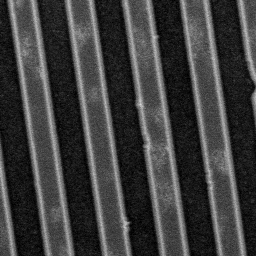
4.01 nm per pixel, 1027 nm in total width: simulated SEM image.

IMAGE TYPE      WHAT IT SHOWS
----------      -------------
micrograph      parallel lines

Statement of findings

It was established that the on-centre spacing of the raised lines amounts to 0.228 microns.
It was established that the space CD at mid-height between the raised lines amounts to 127 nanometres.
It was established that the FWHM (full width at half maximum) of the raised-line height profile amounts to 0.1 um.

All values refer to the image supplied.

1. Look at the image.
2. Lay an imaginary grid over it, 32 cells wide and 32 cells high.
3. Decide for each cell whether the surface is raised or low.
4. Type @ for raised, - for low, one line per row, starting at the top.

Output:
-@@@----@@@@----@@@----@@@----@@
-@@@@----@@@----@@@----@@@----@@
--@@@----@@@----@@@----@@@----@@
--@@@----@@@----@@@----@@@----@@
--@@@----@@@----@@@----@@@@----@
--@@@----@@@----@@@@---@@@@----@
--@@@----@@@----@@@@----@@@----@
--@@@----@@@@----@@@----@@@----@
--@@@@----@@@----@@@----@@@----@
---@@@----@@@----@@@----@@@-----
---@@@----@@@----@@@----@@@-----
---@@@----@@@----@@@----@@@@----
---@@@----@@@----@@@@---@@@@----
---@@@----@@@----@@@@----@@@----
---@@@----@@@@----@@@----@@@----
---@@@@----@@@----@@@----@@@----
----@@@----@@@----@@@----@@@----
----@@@----@@@----@@@----@@@----
----@@@----@@@----@@@----@@@@---
----@@@----@@@----@@@@---@@@@---
----@@@----@@@----@@@@----@@@---
----@@@----@@@@----@@@----@@@---
----@@@@----@@@----@@@----@@@---
@----@@@----@@@----@@@----@@@---
@----@@@----@@@----@@@----@@@---
@----@@@----@@@----@@@----@@@@--
@----@@@----@@@----@@@@----@@@--
@----@@@----@@@@----@@@----@@@--
@----@@@@----@@@----@@@----@@@--
@@----@@@----@@@----@@@----@@@--
@@----@@@----@@@----@@@----@@@--
@@----@@@----@@@----@@@----@@@@-